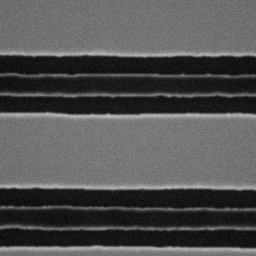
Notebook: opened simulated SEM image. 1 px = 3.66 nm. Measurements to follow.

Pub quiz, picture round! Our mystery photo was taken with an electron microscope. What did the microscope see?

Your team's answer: lines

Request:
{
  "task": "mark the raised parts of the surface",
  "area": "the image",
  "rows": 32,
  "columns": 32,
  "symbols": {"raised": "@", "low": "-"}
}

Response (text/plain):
@@@@@@@@@@@@@@@@@@@@@@@@@@@@@@@@
@@@@@@@@@@@@@@@@@@@@@@@@@@@@@@@@
@@@@@@@@@@@@@@@@@@@@@@@@@@@@@@@@
@@@@@@@@@@@@@@@@@@@@@@@@@@@@@@@@
@@@@@@@@@@@@@@@@@@@@@@@@@@@@@@@@
@@@@@@@@@@@@@@@@@@@@@@@@@@@@@@@@
@@@@@@@@@@@@@@@@@@@@@@@@@@@@@@@@
--------------------------------
--------------------------------
@@@@@@@@@@@@@@@@@@@@@@@@@@@@@@@@
@@@@@@@@@@@@@@@@@@@@@@@@@@@@@@@@
@@@@@@@@@@@@@@@@@@@@@@@@@@@@@@@@
--------------------------------
--------------------------------
@@@@@@@@@@@@@@@@@@@@@@@@@@@@@@@@
@@@@@@@@@@@@@@@@@@@@@@@@@@@@@@@@
@@@@@@@@@@@@@@@@@@@@@@@@@@@@@@@@
@@@@@@@@@@@@@@@@@@@@@@@@@@@@@@@@
@@@@@@@@@@@@@@@@@@@@@@@@@@@@@@@@
@@@@@@@@@@@@@@@@@@@@@@@@@@@@@@@@
@@@@@@@@@@@@@@@@@@@@@@@@@@@@@@@@
@@@@@@@@@@@@@@@@@@@@@@@@@@@@@@@@
@@@@@@@@@@@@@@@@@@@@@@@@@@@@@@@@
--@--@@@@@@@@@@@@@@@@@@@@@@@@@@@
--------------------------------
--------------------------------
@@@@@@@@@@@@@@@@@@@@@@@@@@@@@@@@
@@@@@@@@@@@@@@@@@@@@@@@@@@@@@@@@
@--@@@@@@@@@@@@@@@@@@@@@@@@@@@@@
--------------------------------
--------------------------------
@@@@@@@@@@@@@@@@@@@@@@@@@@@@@@@@